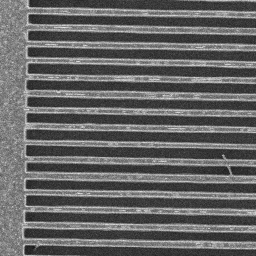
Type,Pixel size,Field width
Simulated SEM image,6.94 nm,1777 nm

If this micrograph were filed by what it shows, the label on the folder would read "parallel lines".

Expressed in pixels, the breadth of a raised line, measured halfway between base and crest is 6.74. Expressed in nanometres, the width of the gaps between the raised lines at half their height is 66.8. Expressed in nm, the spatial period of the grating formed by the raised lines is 114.